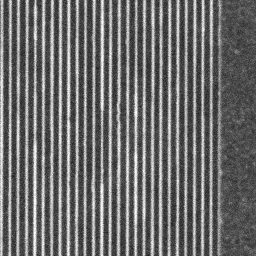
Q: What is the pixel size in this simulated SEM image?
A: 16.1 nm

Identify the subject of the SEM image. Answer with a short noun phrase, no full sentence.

parallel lines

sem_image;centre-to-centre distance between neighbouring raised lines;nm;135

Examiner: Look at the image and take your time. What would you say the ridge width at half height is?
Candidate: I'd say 38.3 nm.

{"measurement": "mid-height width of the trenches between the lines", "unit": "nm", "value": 101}